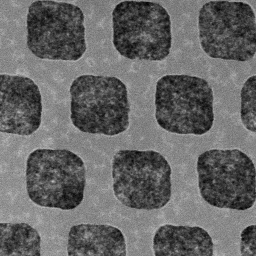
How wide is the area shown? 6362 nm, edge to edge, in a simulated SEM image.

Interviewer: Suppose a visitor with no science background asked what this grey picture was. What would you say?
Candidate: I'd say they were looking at holes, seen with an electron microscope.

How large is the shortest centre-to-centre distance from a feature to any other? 2120 nanometers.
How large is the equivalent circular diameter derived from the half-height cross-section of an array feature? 62.9 px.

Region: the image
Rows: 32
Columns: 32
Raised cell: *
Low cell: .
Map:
****.....******.....******.....*
****......****.......****.......
***........***.......****.......
***........***.......****.......
***........***.......****.......
***........***.......****.......
****.......****......*****......
********.**********.*********..*
********************************
..********..*********...*******.
....*****.......****......*****.
.....****.......***........***..
.....****.......***........***..
.....****.......***........***..
.....****.......***........***..
.....****.......****.......***..
....******.....******.....******
********************************
********************************
****......****......*****......*
***.......****.......****.......
***........***.......****.......
***........***.......****.......
***........***.......****.......
****......****.......****.......
****......*****......*****......
********************************
********************************
....*****......*****.....******.
.....****......****.......****..
.....***........***........***..
.....***........***........***..